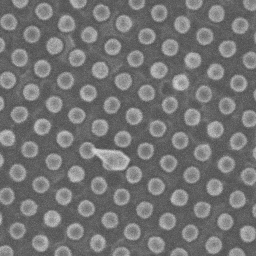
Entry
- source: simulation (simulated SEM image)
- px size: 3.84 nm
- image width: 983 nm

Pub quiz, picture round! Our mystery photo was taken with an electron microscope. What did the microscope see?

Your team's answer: a regular array of raised bodies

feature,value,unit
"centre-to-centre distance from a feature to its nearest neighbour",97.5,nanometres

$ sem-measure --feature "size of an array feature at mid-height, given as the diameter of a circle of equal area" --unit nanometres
60.8